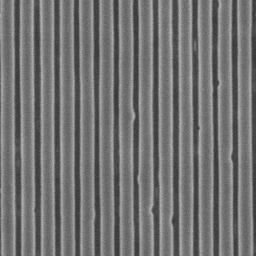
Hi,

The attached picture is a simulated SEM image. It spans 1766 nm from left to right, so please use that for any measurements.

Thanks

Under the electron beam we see parallel lines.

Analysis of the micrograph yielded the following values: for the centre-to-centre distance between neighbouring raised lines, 136 nm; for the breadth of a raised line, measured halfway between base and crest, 0.0949 microns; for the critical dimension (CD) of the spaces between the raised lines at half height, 40.5 nm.